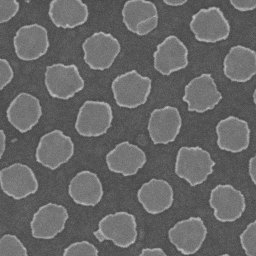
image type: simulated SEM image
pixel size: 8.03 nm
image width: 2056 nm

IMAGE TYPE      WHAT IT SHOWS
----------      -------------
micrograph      a regular array of raised bodies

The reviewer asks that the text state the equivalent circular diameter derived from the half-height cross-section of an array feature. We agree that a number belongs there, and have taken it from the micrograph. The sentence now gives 281 nanometres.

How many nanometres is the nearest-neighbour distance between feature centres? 392